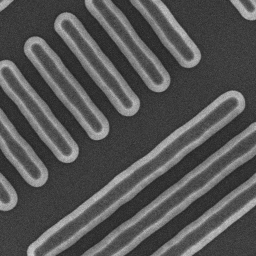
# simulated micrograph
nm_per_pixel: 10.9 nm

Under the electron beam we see groups of lines, slits or small figures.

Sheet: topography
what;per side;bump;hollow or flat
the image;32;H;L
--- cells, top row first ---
HLLLLLLLLLLHHHLLLHHHLLLLLLLLLLHH
LLLLLLLLLLLLHHHLLLHHHLLLLLLLLLHH
LLLLLLLHHLLLLHHHLLLHHLLLLLLLLLLL
LLLLLLLHHHLLLHHHLLLHHHLLLLLLLLLL
LLLLLLLLHHHLLLHHHLLLHHHLLLLLLLLL
LLLLHLLLLHHHLLLHHHLLLHHHLLLLLLLL
LLLHHHLLLLHHLLLLHHHLLLHHHLLLLLLL
LLLLHHHLLLHHHLLLHHHLLLLHHLLLLLLL
HHLLLHHHLLLHHHLLLHHHLLLLLLLLLLLL
HHLLLLHHHLLLHHHLLLHHHLLLLLLLLLLL
HHHLLLHHHLLLLHHLLLLHHLLLLLLLLLLL
LHHHLLLHHHLLLHHHLLLLLLLLLLLLLLLL
LLHHHLLLHHHLLLHHHLLLLLLLLLLHHHLL
LLLHHHLLLHHHLLLHHLLLLLLLLLHHHHLL
LLLLHHLLLLHHLLLLLLLLLLLLLHHHHLLL
HLLLHHHLLLHHHLLLLLLLLLLLHHHHLLLL
HHLLLHHHLLLHHLLLLLLLLLHHHHLLLLLH
HHHLLLHHHLLLLLLLLLLLLHHHHLLLLLHH
HHHLLLLHHLLLLLLLLLLLHHHHLLLLHHHH
LHHHLLLHHLLLLLLLLLLHHHHLLLLHHHHL
LLHHHLLLLLLLLLLLLHHHHLLLLLHHHHLL
LLLHHHLLLLLLLLLLHHHHLLLLHHHHLLLL
LLLLHLLLLLLLLLLHHHHLLLLHHHHLLLLL
HLLLLLLLLLLLLHHHHLLLLLHHHHLLLLHH
HHLLLLLLLLLLHHHHLLLLLHHHHLLLLHHH
HLLLLLLLLLLHHHHLLLLHHHHLLLLLHHHH
LLLLLLLLLLHHHHLLLLHHHHLLLLHHHHLL
LLLLLLLLHHHHLLLLLHHHHLLLLHHHHLLL
LLLLLLLHHHHLLLLHHHHLLLLLHHHHLLLL
LLLLLLHHHHLLLLHHHHLLLLLHHHLLLLLL
LLLLLHHHLLLLLHHHHLLLLHHHHLLLLLLL
LLLLHHHLLLLHHHHHLLLLHHHHLLLLLLLL